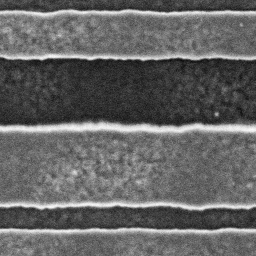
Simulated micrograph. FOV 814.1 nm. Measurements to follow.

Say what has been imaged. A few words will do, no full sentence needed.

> lines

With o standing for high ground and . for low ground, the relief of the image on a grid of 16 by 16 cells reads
oooooooooooooooo
oooooooooooooooo
oooooooooooooooo
oooooooooooooooo
................
................
................
................
oooooooooooooooo
oooooooooooooooo
oooooooooooooooo
oooooooooooooooo
oooooooooooooooo
oooooooooooooooo
oooooooooooooooo
oooooooooooooooo